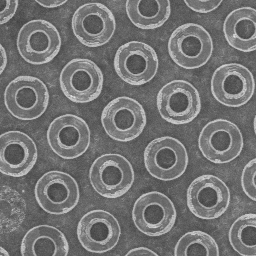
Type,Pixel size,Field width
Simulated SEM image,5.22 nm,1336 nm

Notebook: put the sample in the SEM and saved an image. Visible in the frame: a regular array of ring-shaped raised bodies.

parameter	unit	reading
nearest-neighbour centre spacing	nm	297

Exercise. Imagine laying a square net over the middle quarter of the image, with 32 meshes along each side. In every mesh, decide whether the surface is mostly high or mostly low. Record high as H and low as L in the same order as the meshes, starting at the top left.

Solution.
LHHHHHHHLLLLLHHLLLLLLHHLLLLLLHHH
HHHHLHHHHLLLLHHHLLLLHHHLLLLLLLLL
HHLLLLHHHLLLLLHHHLLHHHHLLLLLLLLL
HHLLLLLHHLLLLLHHHHHHHHLLLLLLLLLL
HHLLLLLHHLLLLLLLHHHHLLLLLLLHHHLL
HHLLLLLHHLLLLLLLLLLLLLLLLHHHHHHH
HHHLLLHHHLLLLLLLLLLLLLLLHHHHHHHH
HHHHHHHHHLLLLLLLLLLLLLLLHHHLLLHH
LHHHHHHHLLLLLLHHLLLLLLLLHHLLLLLH
LLLLLLLLLLLLHHHHHHLLLLLHHHLLLLLH
LLLLLLLLLLLHHHHHHHHLLLLLHHLLLLLH
LLLLLLLLLLHHHHLLHHHHLLLLHHHLLLHH
LLLLLLLLLLHHHLLLLHHHLLLLHHHHHHHH
HHHHLLLLLLHHLLLLLLHHLLLLLHHHHHHH
HHHHHLLLLLHHHLLLLLHHLLLLLLLHHHHL
HLHHHHLLLLHHHLLLLHHHLLLLLLLLLLLL
LLLHHHLLLLHHHHLLHHHLLLLLLLLLLLLL
LLLLHHLLLLLHHHHHHHHLLLLLLLLLLLLL
LLLLHHLLLLLLLHHHHHLLLLLLLHHLLLLL
LLLHHHLLLLLLLLLLLLLLLLHHHHHHHLLL
LLHHHHLLLLLLLLLLLLLLLHHHHHHHHHLL
HHHHHLLLLLLLLLLLLLLLLHHHLLLHHHLL
HHHHLLLLLLLLLLLLLLLLHHHLLLLLHHLL
LLLLLLLLLHHHHHHLLLLLHHHLLLLLHHHL
LLLLLLLLHHHHHHHHLLLLHHHLLLLLHHHL
LLLLLLLHHHHLLHHHHLLLLHHLLLLHHHHL
LLLLLLLHHHLLLLHHHLLLLHHHHHHHHHLL
LLLLLLLHHLLLLLLHHLLLLLHHHHHHHLLL
HHLLLLLHHLLLLLHHHLLLLLLLHHHHLLLL
HHHLLLLHHHLLLLHHHLLLLLLLLLLLLLLL
HHHLLLLHHHHLLHHHHLLLLLLLLLLLLLLH
LHHLLLLLHHHHHHHHLLLLLLLLLLLLLLLH